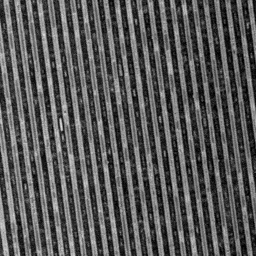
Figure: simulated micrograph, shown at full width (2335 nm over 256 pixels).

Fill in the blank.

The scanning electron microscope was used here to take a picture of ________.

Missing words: parallel lines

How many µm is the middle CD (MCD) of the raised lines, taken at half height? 0.0339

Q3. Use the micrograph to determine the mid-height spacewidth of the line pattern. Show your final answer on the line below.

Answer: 67.8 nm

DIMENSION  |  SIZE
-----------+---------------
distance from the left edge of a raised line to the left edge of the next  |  100 nanometres